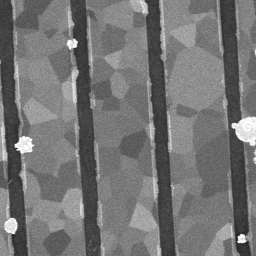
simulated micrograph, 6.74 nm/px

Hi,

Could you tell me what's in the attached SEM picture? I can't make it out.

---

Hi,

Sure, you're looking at one or a few lines or trenches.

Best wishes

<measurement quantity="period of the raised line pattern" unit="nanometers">501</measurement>